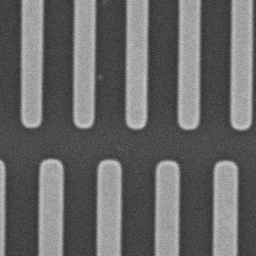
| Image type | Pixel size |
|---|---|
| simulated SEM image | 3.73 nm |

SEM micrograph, groups of lines, slits or small figures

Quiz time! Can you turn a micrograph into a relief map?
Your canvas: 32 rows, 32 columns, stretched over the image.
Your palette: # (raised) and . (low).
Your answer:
...##....###....##.....##....##.
...##....###....##.....##....##.
...##....###....##.....##....##.
...##....###....##.....##....##.
...##....###....##.....##....##.
...##....###....##.....##....##.
...##....###....##.....##....##.
...##....###....##.....##....##.
...##....###....##.....##....##.
...##....###....##.....##....##.
...##....###....##....###....##.
...##....###....##....###....##.
...##....###....##....###....##.
...##....###....##....###....##.
...##....###....##....###....##.
...##.....#.....##.....##....##.
................................
................................
................................
................................
.....###.....##.....##.....##...
.....###....###.....##.....###..
.....###....###.....##.....###..
.....###....###.....##.....###..
.....###....###.....##.....###..
.....###....###.....##.....##...
.....###....###.....##.....##...
.....###....###.....##.....##...
.....###....###.....##.....##...
.....###....###.....##.....##...
.....###....###.....##.....##...
.....###....###.....##.....##...